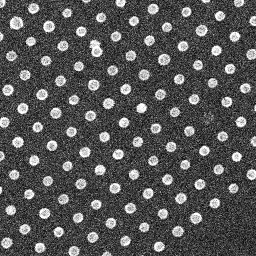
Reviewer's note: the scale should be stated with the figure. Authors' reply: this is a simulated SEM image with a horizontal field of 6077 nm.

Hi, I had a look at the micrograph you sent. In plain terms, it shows a regular array of raised bodies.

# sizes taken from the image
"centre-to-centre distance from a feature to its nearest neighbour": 545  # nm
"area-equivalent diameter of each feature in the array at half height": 0.216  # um